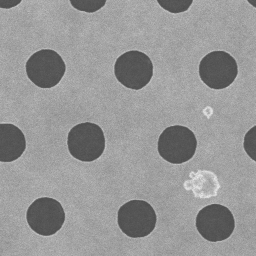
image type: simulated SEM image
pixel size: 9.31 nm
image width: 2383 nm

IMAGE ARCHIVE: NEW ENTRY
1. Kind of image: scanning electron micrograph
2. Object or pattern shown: a regular array of holes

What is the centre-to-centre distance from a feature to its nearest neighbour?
784 nanometers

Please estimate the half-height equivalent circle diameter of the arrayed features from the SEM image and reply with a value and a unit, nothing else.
0.361 um